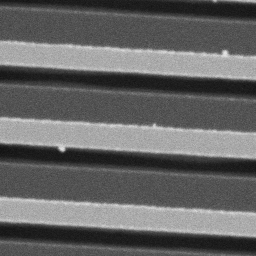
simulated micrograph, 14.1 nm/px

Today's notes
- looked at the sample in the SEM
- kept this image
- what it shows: lines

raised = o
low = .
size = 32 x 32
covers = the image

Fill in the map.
................................
oooooooooooo....................
ooooooooooooooooooooooooooo.....
oooooooooooooooooooooooooooooooo
oooooooooooooooooooooooooooooooo
oooooooooooooooooooooooooooooooo
oooooooooooooooooooooooooooooooo
oooooooooooooooooooooooooooooooo
......oooooooooooooooooooooooooo
......................oooooooooo
o...............................
ooooooooooooooo.................
oooooooooooooooooooooooooooooooo
oooooooooooooooooooooooooooooooo
oooooooooooooooooooooooooooooooo
oooooooooooooooooooooooooooooooo
oooooooooooooooooooooooooooooooo
oooooooooooooooooooooooooooooooo
.......o.ooooooooooooooooooooooo
.........................ooooooo
ooo.............................
ooooooooooooooooooo.............
oooooooooooooooooooooooooooooooo
oooooooooooooooooooooooooooooooo
oooooooooooooooooooooooooooooooo
oooooooooooooooooooooooooooooooo
oooooooooooooooooooooooooooooooo
oooooooooooooooooooooooooooooooo
............oooooooooooooooooooo
.............................ooo
ooooo...........................
ooooooooooooooooooooooo.........